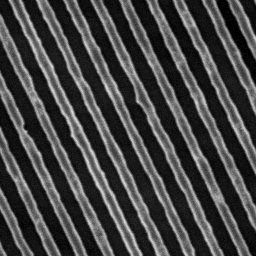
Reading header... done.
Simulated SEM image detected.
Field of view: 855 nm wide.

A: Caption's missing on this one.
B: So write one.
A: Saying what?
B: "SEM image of parallel lines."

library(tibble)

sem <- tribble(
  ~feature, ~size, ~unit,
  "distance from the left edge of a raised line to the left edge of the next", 0.0825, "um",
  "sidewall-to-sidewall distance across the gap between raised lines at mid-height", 49.5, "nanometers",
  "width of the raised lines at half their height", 32.8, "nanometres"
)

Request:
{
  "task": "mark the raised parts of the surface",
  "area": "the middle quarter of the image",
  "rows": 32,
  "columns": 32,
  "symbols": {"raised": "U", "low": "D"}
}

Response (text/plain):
DUUDDDDDUUUDDDDUUDDDDDUUDDDDUUUD
DUUUDDDDUUUDDDDUUUDDDDUUUDDDDUUD
DDUUDDDDDUUDDDDDUUDDDDDUUDDDDUUU
DDUUUDDDDUUUDDDDUUDDDDDUUUDDDDUU
DDDUUDDDDDUUUDDDDUUDDDDDUUDDDDUU
DDDDUUDDDDUUUDDDDDUUDDDDUUUDDDDU
DDDDUUUDDDDUUUDDDDUUDDDDDUUDDDDU
DDDDDUUDDDDUUUDDDDUUUDDDDUUUDDDD
UDDDDUUDDDDDUUDDDDUUUDDDDUUUDDDD
UDDDDUUUDDDDUUUDDDUUUUDDDDUUDDDD
UUDDDDUUDDDDDUUDDDDUUUDDDDUUUDDD
UUDDDDUUUDDDDUUUDDDDUUUDDDDUUUDD
UUDDDDDUUDDDDDUUDDDDDUUDDDDUUUDD
DUUDDDDUUUDDDDUUDDDDDUUDDDDDUUDD
DUUUDDDDUUDDDDDUUDDDDUUUDDDDUUUD
DDUUDDDDUUUDDDDUUUDDDDUUDDDDDUUD
DDUUDDDDDUUDDDDDUUDDDDUUUDDDDUUU
DDUUUDDDDUUUDDDDUUUDDDDUUUDDDUUU
DDUUUDDDDDUUDDDDDUUDDDDUUUDDDDUU
DDDUUUDDDDUUUDDDDUUUDDDDUUUDDDDU
DDDDUUDDDDDUUDDDDUUUDDDDUUUDDDDU
DDDDUUUDDDDUUUDDDDUUUDDDDUUDDDDU
UDDDDUUDDDDUUUDDDDUUUDDDDDUUDDDD
UDDDDUUUDDDDUUUDDDDUUDDDDDUUDDDD
UDDDDDUUDDDDUUUDDDDUUUDDDDUUUDDD
UUDDDDUUDDDDDUUUDDDDUUDDDDDUUDDD
UUDDDDUUUDDDDDUUDDDDUUUDDDDUUUDD
UUUDDDDUUUDDDDUUUDDDDUUDDDDDUUDD
DUUDDDDDUUDDDDUUUDDDDDUUDDDDUUUD
DUUUDDDDUUUDDDDUUUDDDDUUUDDDUUUD
DDUUDDDDUUUDDDDUUUDDDDUUUDDDDUUU
DDUUUDDDDUUUDDDDUUDDDDDUUDDDDDUU